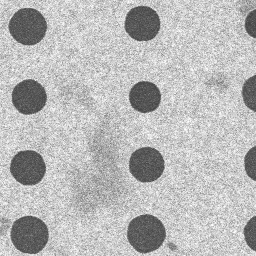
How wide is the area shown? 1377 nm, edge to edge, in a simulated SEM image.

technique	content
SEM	a regular array of holes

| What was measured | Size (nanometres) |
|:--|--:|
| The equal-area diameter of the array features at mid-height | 192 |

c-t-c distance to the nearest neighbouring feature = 368 nm